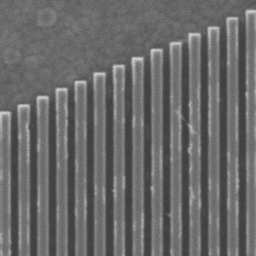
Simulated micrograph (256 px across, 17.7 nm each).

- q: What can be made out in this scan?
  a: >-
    parallel lines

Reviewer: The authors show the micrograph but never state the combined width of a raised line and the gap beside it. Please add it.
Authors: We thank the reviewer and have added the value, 336 nanometers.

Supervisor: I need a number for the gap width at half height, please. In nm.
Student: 142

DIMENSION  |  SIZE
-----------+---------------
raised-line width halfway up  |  190 nm